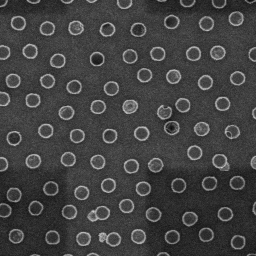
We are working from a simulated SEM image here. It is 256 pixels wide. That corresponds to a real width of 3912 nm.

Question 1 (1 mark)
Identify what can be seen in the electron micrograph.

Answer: a regular array of raised bodies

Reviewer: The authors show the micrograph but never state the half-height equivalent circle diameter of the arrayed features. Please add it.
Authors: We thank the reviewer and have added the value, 211 nm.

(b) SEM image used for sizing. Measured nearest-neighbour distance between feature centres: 392 nm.